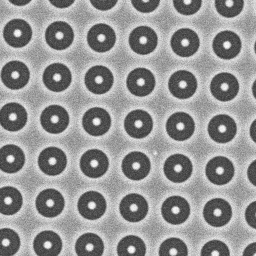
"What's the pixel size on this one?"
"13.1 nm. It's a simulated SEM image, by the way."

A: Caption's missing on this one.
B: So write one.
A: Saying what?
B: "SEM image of an array of small figures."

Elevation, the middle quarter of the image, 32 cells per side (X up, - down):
-XXXXXX---XXXXXXXXXXXXXXXXXXXXXX
-XXXXX------XXXXX----XXXXXXXX--X
--XXX-------XXXX------XXXXX-----
--XXX---X---XXXX-------XXX------
--XXX---X---XXX----X---XXX---X--
-XXXX-------XXXX-------XXX---X--
XXXXXX-----XXXXX------XXXX------
XXXXXXXX--XXXXXXX----XXXXXX-----
XXXXXXXXXXXXXXXXXXXXXXXXXXXX---X
XXXXXXXXXXXXXXXXXXXXXXXXXXXXXXXX
XXXXXXXXXXXXXXXXXXXXXXXXXXXXXXXX
-XXXXX-----XXXXXX---XXXXXXXXXXXX
-XXXX------XXXXX-----XXXXXX----X
-XXX--------XXX-------XXXX------
-XXX---XX---XXX---X---XXX-------
-XXXX-------XXX---X---XXX---XX--
XXXXX------XXXX-------XXXX------
XXXXXX----XXXXXX-----XXXXX------
XXXXXXXXXXXXXXXXXX--XXXXXXX----X
XXXXXXXXXXXXXXXXXXXXXXXXXXXXXXXX
XXXXXXXXXXXXXXXXXXXXXXXXXXXXXXXX
XXXXXX---XXXXXXXXXXXXXXXXXXXXXXX
XXXXX------XXXXX----XXXXXXXX--XX
-XXX-------XXXX------XXXXX-----X
-XXX---X---XXX--------XXX-------
-XXX---X---XXX---XX---XXX---X---
XXXX-------XXX--------XXX---X---
XXXXX-----XXXXX------XXXX-------
XXXXXX---XXXXXXX----XXXXXX-----X
XXXXXXXXXXXXXXXXXXXXXXXXXXX---XX
XXXXXXXXXXXXXXXXXXXXXXXXXXXXXXXX
XXXXXXXXXXXXXXXXXXXXXXXXXXXXXXXX